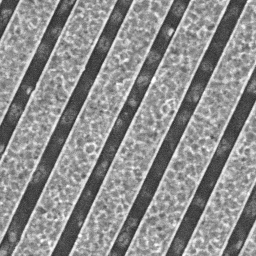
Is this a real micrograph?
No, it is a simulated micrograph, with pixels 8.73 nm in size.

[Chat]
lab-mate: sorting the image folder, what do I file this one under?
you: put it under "parallel lines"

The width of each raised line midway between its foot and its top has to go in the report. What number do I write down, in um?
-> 0.296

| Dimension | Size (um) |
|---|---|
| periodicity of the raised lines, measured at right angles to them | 0.447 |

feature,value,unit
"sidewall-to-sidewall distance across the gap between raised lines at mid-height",152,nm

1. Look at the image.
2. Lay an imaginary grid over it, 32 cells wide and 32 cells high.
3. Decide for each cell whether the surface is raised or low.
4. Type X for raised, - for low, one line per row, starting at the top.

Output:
--XXXXX---XXXX---XXXX---XXXX---X
--XXXXX--XXXXX--XXXXX--XXXXX--XX
-XXXXX---XXXX---XXXX---XXXX---XX
-XXXXX--XXXXX--XXXXX--XXXXX---XX
XXXXX---XXXX---XXXX---XXXX---XXX
XXXXX--XXXXX--XXXXX--XXXXX---XXX
XXXX---XXXX---XXXX---XXXX---XXXX
XXXX--XXXXX--XXXXX--XXXXX---XXXX
XXX---XXXX---XXXX---XXXXX--XXXXX
XXX--XXXXX--XXXXX--XXXXX---XXXX-
XX---XXXX---XXXX---XXXXX--XXXXX-
XX--XXXXX--XXXXX--XXXXX---XXXX--
X---XXXX---XXXX---XXXXX--XXXXX--
X--XXXXX--XXXXX--XXXXX---XXXX---
---XXXX---XXXXX--XXXXX--XXXXX--X
--XXXXX--XXXXX---XXXX---XXXX---X
--XXXX---XXXXX--XXXXX--XXXXX--XX
-XXXXX---XXXX---XXXX---XXXX---XX
-XXXX---XXXXX--XXXXX--XXXXX--XXX
XXXXX---XXXX---XXXX---XXXX---XXX
XXXXX--XXXXX--XXXXX--XXXXX--XXXX
XXXX---XXXX---XXXX---XXXX---XXXX
XXXX--XXXXX--XXXXX--XXXXX--XXXXX
XXX---XXXX---XXXX---XXXX---XXXX-
XXX--XXXXX--XXXXX--XXXXX---XXXX-
XX---XXXX---XXXX---XXXXX--XXXX--
XX--XXXXX--XXXXX--XXXXX---XXXX--
X---XXXX---XXXX---XXXXX--XXXXX--
X--XXXXX--XXXXX--XXXXX---XXXX---
---XXXX---XXXX---XXXXX--XXXXX--X
--XXXXX---XXXX--XXXXX---XXXX---X
--XXXX---XXXXX--XXXXX--XXXXX--XX